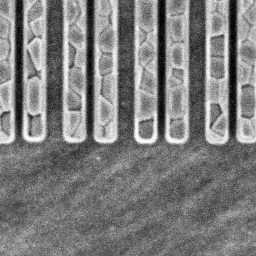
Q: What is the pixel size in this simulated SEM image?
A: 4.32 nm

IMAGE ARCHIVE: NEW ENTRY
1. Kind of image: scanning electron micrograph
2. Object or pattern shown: parallel lines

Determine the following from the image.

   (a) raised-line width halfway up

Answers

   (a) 95 nanometers